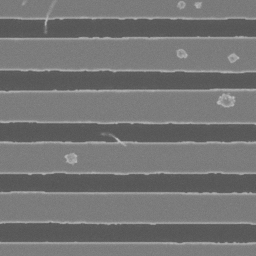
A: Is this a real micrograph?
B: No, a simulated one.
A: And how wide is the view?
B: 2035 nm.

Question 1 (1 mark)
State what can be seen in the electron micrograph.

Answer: lines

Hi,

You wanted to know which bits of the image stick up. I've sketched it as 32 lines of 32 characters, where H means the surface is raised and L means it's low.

HHHHHHHHHHHHHHHHHHHHHHHHHHHHHHHH
HHHHHHHHHHHHHHHHHHHHHHHHHHHHHHHH
LLLLLHLLLLLLLLLLLLLLLLLLLLLLLLLL
LLLLLLLLLLLLLLLLLLLLLLLLLLLLLLLL
LLLLLLLLLLLLLLLLLLLLLLLLLLLLLLLL
HHHHHHHHHHHHHHHHHHHHHHHHHHHHHHHH
HHHHHHHHHHHHHHHHHHHHHHHHHHHHHHHH
HHHHHHHHHHHHHHHHHHHHHHHHHHHHHHHH
HHHHHHHHHHHHHHHHHHHHHHHHHHHHHHHH
LLLLLLLLLLLLLLLLLLLLLLLLLLLLLLLL
LLLLLLLLLLLLLLLLLLLLLLLLLLLLLLLL
HHHHHHHHHHHHHHHHHHHHHHHHHHHHHHHH
HHHHHHHHHHHHHHHHHHHHHHHHHHHHHHHH
HHHHHHHHHHHHHHHHHHHHHHHHHHHHHHHH
HHHHHHHHHHHHHHHHHHHHHHHHHHHHHHHH
LLLLLLLLLLLLLLLLLLLLLLLLLLHLLLLH
LLLLLLLLLLLLLLLLLLLLLLLLLLLLLLLL
LLLLLLLLLLLLLLLLLLLLLLLLLLLLLLLL
HHHHHHHHHHHHHHHHHHHHHHHHHHHHHHHH
HHHHHHHHHHHHHHHHHHHHHHHHHHHHHHHH
HHHHHHHHHHHHHHHHHHHHHHHHHHHHHHHH
HHHHHHHHHHHHHHHHHHHHHHHHHHHHHHHH
LLLLLLLLLLLLLLLLLLLLLLLLLLLLLLLL
LLLLLLLLLLLLLLLLLLLLLLLLLLLLLLLL
HHHHHHHHHHHHHHHHHHHHHHHHHHHHHHHH
HHHHHHHHHHHHHHHHHHHHHHHHHHHHHHHH
HHHHHHHHHHHHHHHHHHHHHHHHHHHHHHHH
HHHHHHHHHHHHHHHHHHHHHHHHHHHHHHHH
LLLLLLLLLLLLLLLLLLLLLLLLLLLLLLLL
LLLLLLLLLLLLLLLLLLLLLLLLLLLLLLLL
HHHHHHHHHHHHHHHHHHHHHHHHHHHHHHHH
HHHHHHHHHHHHHHHHHHHHHHHHHHHHHHHH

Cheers